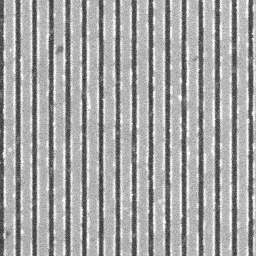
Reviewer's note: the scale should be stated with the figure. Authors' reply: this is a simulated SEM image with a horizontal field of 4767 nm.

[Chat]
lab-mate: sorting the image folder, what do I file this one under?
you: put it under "parallel lines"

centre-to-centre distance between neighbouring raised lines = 310 nm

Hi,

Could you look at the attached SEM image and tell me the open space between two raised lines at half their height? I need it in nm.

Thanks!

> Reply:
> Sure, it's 109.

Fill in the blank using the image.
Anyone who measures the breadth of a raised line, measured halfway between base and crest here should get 205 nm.